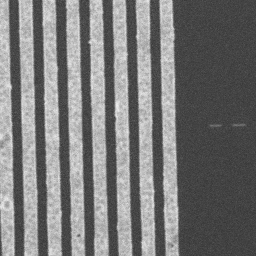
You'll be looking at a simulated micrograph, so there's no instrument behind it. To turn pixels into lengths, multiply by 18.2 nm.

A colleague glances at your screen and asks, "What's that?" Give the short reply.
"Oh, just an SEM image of parallel lines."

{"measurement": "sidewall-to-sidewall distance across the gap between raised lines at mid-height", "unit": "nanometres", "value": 205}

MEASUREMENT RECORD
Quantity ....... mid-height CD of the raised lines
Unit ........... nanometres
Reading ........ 216